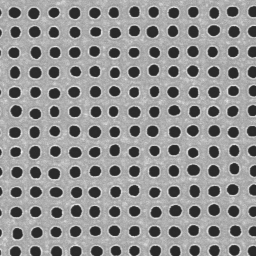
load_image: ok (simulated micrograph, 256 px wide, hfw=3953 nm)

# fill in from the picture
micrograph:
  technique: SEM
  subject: a regular array of holes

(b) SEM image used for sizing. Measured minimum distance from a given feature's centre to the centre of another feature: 0.291 micrometres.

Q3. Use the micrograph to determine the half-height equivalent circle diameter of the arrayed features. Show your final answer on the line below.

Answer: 11.4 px